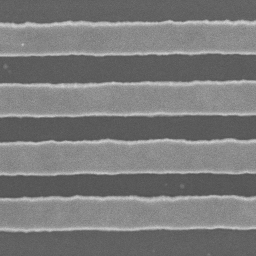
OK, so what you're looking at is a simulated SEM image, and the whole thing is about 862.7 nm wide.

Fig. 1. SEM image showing lines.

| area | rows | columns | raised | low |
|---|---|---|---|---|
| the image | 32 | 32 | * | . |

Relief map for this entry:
................................
................................
................................
********************************
********************************
********************************
********************************
................................
................................
................................
***.****************************
********************************
********************************
********************************
*.********......................
................................
................................
............***...*****....***.*
********************************
********************************
********************************
********************************
................................
................................
.........*......*.........****..
********************************
********************************
********************************
***************************.****
................................
................................
................................